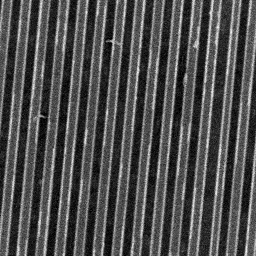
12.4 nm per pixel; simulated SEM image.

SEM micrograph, parallel lines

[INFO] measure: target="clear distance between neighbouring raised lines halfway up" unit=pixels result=9.7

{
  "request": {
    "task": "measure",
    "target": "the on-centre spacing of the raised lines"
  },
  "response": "0.236 um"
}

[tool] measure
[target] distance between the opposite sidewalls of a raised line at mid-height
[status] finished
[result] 120 nanometres